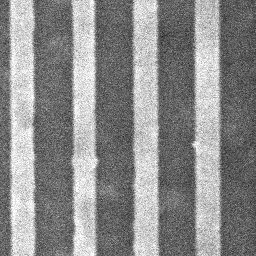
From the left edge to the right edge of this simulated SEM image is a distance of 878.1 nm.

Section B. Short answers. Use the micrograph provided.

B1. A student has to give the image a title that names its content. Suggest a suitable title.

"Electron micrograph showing one or a few lines or trenches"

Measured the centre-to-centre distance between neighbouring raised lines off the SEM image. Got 0.211 microns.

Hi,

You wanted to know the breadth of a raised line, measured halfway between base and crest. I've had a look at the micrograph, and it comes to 75.4 nm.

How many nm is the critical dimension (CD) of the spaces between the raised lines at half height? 137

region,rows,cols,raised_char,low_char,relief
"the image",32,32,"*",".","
..**.....***.....***.....**.....
..**.....***.....***.....**.....
..**.....***.....***.....**.....
.***.....***.....***.....**.....
.***.....***.....***.....**.....
..**.....***.....***.....**.....
..**.....***.....***.....**.....
..**.....***.....***.....**.....
..**.....***.....***.....**.....
.***.....***.....***.....**.....
.***.....***.....***.....**.....
.***.....***.....***....***.....
.***.....***.....***.....**.....
.***.....***.....***.....**.....
..**.....***.....***.....**.....
..**.....***.....***.....**.....
..**.....***.....***.....**.....
..**.....***.....***....***.....
..**.....***.....***....***.....
.***.....***.....***.....**.....
..**.....***.....***.....**.....
..**.....***.....***.....**.....
..**.....***.....***.....**.....
..**.....***.....***.....**.....
..**.....***.....***.....**.....
..**.....***.....***.....**.....
..**.....***.....***.....**.....
..**.....***.....***.....**.....
..**.....***.....***.....**.....
..**.....***.....***.....**.....
..**.....***.....***.....**.....
..**.....***.....***.....**.....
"